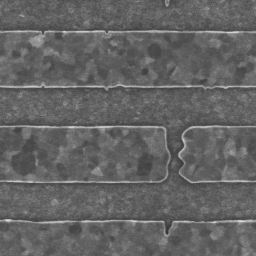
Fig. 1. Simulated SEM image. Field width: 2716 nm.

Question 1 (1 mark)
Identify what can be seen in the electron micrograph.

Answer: one or a few lines or trenches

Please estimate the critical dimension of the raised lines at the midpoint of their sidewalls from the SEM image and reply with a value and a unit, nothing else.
0.582 um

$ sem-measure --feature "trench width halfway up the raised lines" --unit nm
422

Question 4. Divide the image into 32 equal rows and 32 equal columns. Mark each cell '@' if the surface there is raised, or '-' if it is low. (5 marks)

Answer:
--------------------------------
--------------------------------
--------------------------------
--------------------------------
@@@@@@@@@@@@@@@@@@@@@@@@@@@@@@@@
@@@@@@@@@@@@@@@@@@@@@@@@@@@@@@@@
@@@@@@@@@@@@@@@@@@@@@@@@@@@@@@@@
@@@@@@@@@@@@@@@@@@@@@@@@@@@@@@@@
@@@@@@@@@@@@@@@@@@@@@@@@@@@@@@@@
@@@@@@@@@@@@@@@@@@@@@@@@@@@@@@@@
@@@@@@@@@@@@@@@@@@@@@@@@@@@@@@@@
--------------------------------
--------------------------------
--------------------------------
--------------------------------
--------------------------------
@@@@@@@@@@@@@@@@@@@@@--@@@@@@@@@
@@@@@@@@@@@@@@@@@@@@@--@@@@@@@@@
@@@@@@@@@@@@@@@@@@@@@--@@@@@@@@@
@@@@@@@@@@@@@@@@@@@@@-@@@@@@@@@@
@@@@@@@@@@@@@@@@@@@@@--@@@@@@@@@
@@@@@@@@@@@@@@@@@@@@@-@@@@@@@@@@
@@@@@@@@@@@@@@@@@@@@---@@@@@@@@@
--------------------------------
--------------------------------
--------------------------------
--------------------------------
--------------------------------
@@@@@@@@@@@@@@@@@@@@@@@@@@@@@@@@
@@@@@@@@@@@@@@@@@@@@@@@@@@@@@@@@
@@@@@@@@@@@@@@@@@@@@@@@@@@@@@@@@
@@@@@@@@@@@@@@@@@@@@@@@@@@@@@@@@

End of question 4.